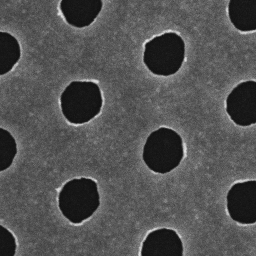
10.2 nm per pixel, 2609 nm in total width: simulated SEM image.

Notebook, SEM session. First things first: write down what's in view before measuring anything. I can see holes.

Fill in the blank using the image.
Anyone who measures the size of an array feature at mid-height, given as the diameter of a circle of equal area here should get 0.433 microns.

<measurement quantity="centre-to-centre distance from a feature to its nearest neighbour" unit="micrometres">0.975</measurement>